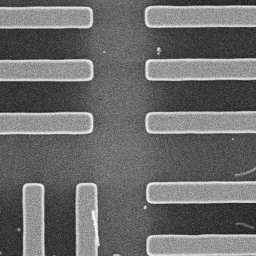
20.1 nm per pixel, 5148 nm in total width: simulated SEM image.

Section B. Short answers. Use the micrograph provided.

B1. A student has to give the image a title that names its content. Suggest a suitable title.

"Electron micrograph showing groups of lines, slits or small figures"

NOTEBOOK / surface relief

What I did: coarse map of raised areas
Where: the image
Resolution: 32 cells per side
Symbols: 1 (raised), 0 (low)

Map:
00000000000000000000000000000000
11111111111000000011111111111111
11111111111100000011111111111111
00000000000000000000000000000000
00000000000000000000000000000000
00000000000000000000000000000000
00000000000000000000000000000000
10011111111000000001111111111111
11111111111100000011111111111111
11111111111100000011111111111111
00000000000000000000000000000000
00000000000000000000000000000000
00000000000000000000000000000000
00000000000000000000000000000000
11111111111000000011111111111111
11111111111100000011111111111111
11111111111000000001111111111111
00000000000000000000000000000000
00000000000000000000000000000000
00000000000000000000000000000000
00000000000000000000000000000000
00000000000000000000000000000000
00000000000000000000000000000000
00011000001100000011111111111111
00011000001100000011111111111111
00011000001100000000000000000000
00011000001100000000000000000000
00011000001100000000000000000000
00011000001100000000000000000000
00011000001100000001111111111111
00011000001100000011111111111111
00011100001100000011111111111111